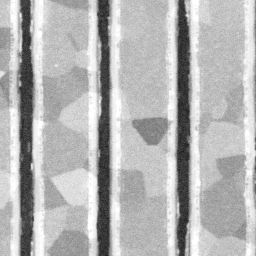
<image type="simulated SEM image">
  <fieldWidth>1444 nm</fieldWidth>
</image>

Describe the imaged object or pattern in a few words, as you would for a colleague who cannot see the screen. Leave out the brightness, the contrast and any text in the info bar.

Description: one or a few lines or trenches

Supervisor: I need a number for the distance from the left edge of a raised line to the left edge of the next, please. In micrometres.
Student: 0.441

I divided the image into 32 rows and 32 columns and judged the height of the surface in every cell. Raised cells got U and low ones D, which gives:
UUDDDUUUUUUUDDDUUUUUUDDDUUUUUUUD
UUDDDUUUUUUUDDDUUUUUUDDDUUUUUUUD
UUDDDUUUUUUUDDDUUUUUUDDDUUUUUUUD
UUDDDUUUUUUUDDUUUUUUUDDDUUUUUUUD
UUDDDUUUUUUUDDUUUUUUUDDDUUUUUUUD
UUDDDUUUUUUUDDUUUUUUUDDDUUUUUUUD
UUDDDUUUUUUUDDUUUUUUUUDDUUUUUUUD
UUDDDUUUUUUUDDUUUUUUUUDDUUUUUUUD
UUDDDUUUUUUUDDUUUUUUUUDDUUUUUUUD
UUDDDUUUUUUUDDUUUUUUUUDDUUUUUUUD
UUDDDUUUUUUUDDUUUUUUUUDDUUUUUUUD
UUDDDUUUUUUUDDUUUUUUUUDDUUUUUUUD
UUDDDUUUUUUUDDUUUUUUUUDDUUUUUUUD
UUDDDUUUUUUUDDDUUUUUUUDDUUUUUUUD
UUDDDUUUUUUUDDDUUUUUUUDDUUUUUUUD
UUDDDUUUUUUUDDDUUUUUUUDDUUUUUUUD
UUDDDUUUUUUUDDDUUUUUUDDDUUUUUUUD
UUDDDUUUUUUUDDDUUUUUUDDDUUUUUUUD
UUDDDUUUUUUUDDUUUUUUUDDDUUUUUUUD
UUDDDUUUUUUUDDDUUUUUUDDDUUUUUUUD
UUDDDUUUUUUUDDDUUUUUUDDDUUUUUUUD
UUDDDUUUUUUUDDUUUUUUUDDDUUUUUUUD
UUDDDUUUUUUUDDUUUUUUUDDDUUUUUUUD
UUDDDUUUUUUUDDUUUUUUUDDDUUUUUUUD
UUDDDUUUUUUUDDUUUUUUUDDDUUUUUUUD
UUDDDUUUUUUUDDUUUUUUUDDDUUUUUUUD
UUDDDUUUUUUUDDUUUUUUUDDDUUUUUUUD
UUDDDUUUUUUUDDUUUUUUUDDDUUUUUUUD
UUDDDUUUUUUUDDUUUUUUUDDDUUUUUUUD
UUDDDUUUUUUUDDUUUUUUUDDDUUUUUUUD
UUDDDUUUUUUUDDUUUUUUUUDDUUUUUUUD
UUDDDUUUUUUUDDUUUUUUUDDDUUUUUUUD